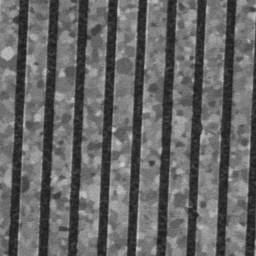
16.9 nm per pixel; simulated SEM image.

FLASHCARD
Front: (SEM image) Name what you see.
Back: parallel lines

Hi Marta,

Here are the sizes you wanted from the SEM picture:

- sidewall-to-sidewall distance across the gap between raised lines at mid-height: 173 nm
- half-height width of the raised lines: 19.2 px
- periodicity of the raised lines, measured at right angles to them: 500 nanometers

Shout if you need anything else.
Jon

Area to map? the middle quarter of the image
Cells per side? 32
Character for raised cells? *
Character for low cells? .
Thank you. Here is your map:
***...****...*****..*****...****
***..*****...*****..*****...****
***..*****...*****..*****...****
***..*****...*****..*****...****
***..*****...****...*****...****
***..*****...****...*****...****
**...*****...****...*****...****
**...*****...****...*****..*****
**...*****...****...*****..*****
**...*****..*****...*****..*****
**...*****..*****...*****..*****
**...*****..*****...*****..*****
**...*****..*****...****...*****
**...*****..*****...****...*****
**...****...*****...****...*****
**...****...*****...****...*****
**...****...*****...****...*****
**...****...*****...****...*****
**...****...*****...****...*****
**...****...*****...****...*****
**...****...*****...****...****.
**...****...*****..*****...****.
**...****...*****..*****...****.
**..*****...*****..*****...****.
**..*****...*****..*****...****.
**..*****...*****..*****...****.
**..*****...****...*****...****.
**..*****...****...*****...****.
*...*****...****...*****...****.
*...*****...****...*****..*****.
*...*****...****...*****..*****.
*...*****..*****...*****..*****.